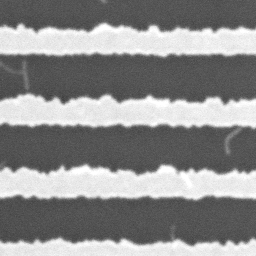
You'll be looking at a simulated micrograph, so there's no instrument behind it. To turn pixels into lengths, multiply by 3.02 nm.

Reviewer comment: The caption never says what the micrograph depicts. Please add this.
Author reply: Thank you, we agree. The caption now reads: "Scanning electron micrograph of lines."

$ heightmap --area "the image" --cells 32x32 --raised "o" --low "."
................................
................................
................................
o.o.............................
oooooooooooooooooooooooooooooooo
oooooooooooooooooooooooooooooooo
oooooooooooooooooooooooooooooooo
................................
................................
................................
................................
................................
.oooo....ooooo....o.......o.....
oooooooooooooooooooooooooooooooo
oooooooooooooooooooooooooooooooo
...oo.....oooo.oo.oo.oooo.ooo.oo
................................
................................
................................
................................
................................
o.oo...o..oooo......oo...o......
oooooooooooooooooooooooooooooooo
oooooooooooooooooooooooooooooooo
o..o.ooooo.ooooooo.oooooo..o.ooo
................................
................................
................................
................................
................................
.oooooooo.oooo.o....ooo...o.o.oo
oooooooooooooooooooooooooooooooo